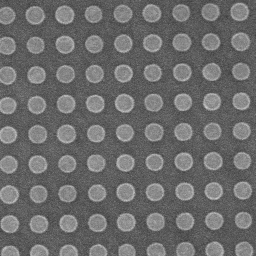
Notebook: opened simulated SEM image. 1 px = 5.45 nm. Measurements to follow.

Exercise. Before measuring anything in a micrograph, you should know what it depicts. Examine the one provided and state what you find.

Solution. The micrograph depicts a regular array of raised bodies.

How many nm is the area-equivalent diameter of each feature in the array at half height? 93.9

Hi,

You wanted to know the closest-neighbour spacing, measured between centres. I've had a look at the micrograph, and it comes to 0.159 microns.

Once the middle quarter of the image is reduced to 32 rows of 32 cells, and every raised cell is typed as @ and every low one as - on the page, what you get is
@-------------@@-----@@-----@@@-
@@----@@@@---@@@@---@@@@---@@@@@
@@----@@@@---@@@@---@@@@---@@@@@
@@----@@@----@@@-----@@@----@@@-
@------@------------------------
--------------------------------
--------------------------------
--------------------------------
@@----@@@----@@@@----@@@----@@@-
@@----@@@@---@@@@---@@@@----@@@@
@@@---@@@@---@@@@---@@@@----@@@@
@@----@@@-----@@@----@@@-----@--
--------------------------------
--------------------------------
--------------------------------
@@------------@@-----@@@----@@@-
@@@---@@@@---@@@@---@@@@@---@@@@
@@@---@@@@---@@@@---@@@@@---@@@@
@@----@@@@----@@@----@@@----@@@-
@@------------------------------
--------------------------------
--------------------------------
-----------------------------@@-
@@----@@@@----@@@----@@@----@@@@
@@@---@@@@---@@@@----@@@@---@@@@
@@@---@@@@---@@@@----@@@@---@@@@
@@-----@@-----@@----------------
--------------------------------
--------------------------------
--------------------------------
@@-----@@-----@@@----@@@-----@@@
@@@---@@@@---@@@@----@@@@---@@@@